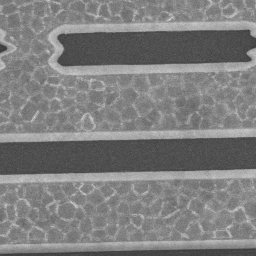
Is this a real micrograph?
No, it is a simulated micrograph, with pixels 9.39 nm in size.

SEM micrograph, one or a few lines or trenches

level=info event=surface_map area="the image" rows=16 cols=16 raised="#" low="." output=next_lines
################
################
###.............
###.............
################
################
################
################
#####...........
................
................
################
################
################
################
####............